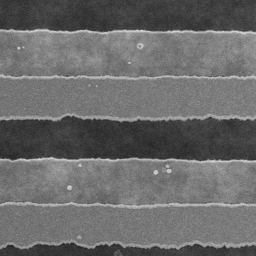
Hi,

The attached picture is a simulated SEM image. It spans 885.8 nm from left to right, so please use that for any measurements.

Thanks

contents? lines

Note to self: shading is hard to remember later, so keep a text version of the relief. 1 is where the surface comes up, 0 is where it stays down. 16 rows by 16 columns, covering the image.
0000000000000000
0000000000000000
1111111111111111
1111111111111111
1111111111111111
1111111111111111
1111111111111111
0000000100000000
0000000000000000
0000000000000000
1111111111111111
1111111111111111
1111111111111111
1111111111111111
1111111111111111
0000000000000000